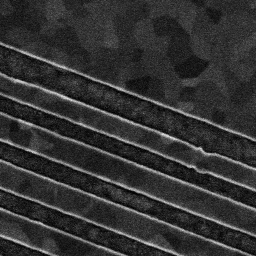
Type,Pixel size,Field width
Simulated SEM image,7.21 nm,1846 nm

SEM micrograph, parallel lines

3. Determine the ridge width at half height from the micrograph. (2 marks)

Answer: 183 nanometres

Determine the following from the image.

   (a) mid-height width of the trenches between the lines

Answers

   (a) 0.142 micrometres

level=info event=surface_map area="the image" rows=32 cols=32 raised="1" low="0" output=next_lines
11111111111111111111111111111111
11111111111111111111111111111111
11111111111111111111111111111111
11111111111111111111111111111111
11111111111111111111111111111111
11111111111111111111111111111111
00011111111111111111111111111111
00000111111111111111111111111111
00000000111111111111111111111111
10000000000111111111111111111111
11110000000001111111111111111111
11111100000000001111111111111111
00111111100000000011111111111111
00001111111100000000011111111111
10000001111111100000000011111111
11110000001111111000000000011111
11111100000001111111000000000111
11111111100000011111110000000000
00011111111100000011111110000000
00000111111111000000111111110000
10000000111111111000000111111100
11110000000111111111000001111111
11111100000001111111110000001111
11111111100000001111111110000001
00011111111100000001111111100000
00000111111111100000011111111100
10000000111111111000000011111111
11110000000111111111000000111111
11111100000001111111110000000111
11111111100000001111111110000000
00011111111100000011111111110000
00000111111111000000011111111100